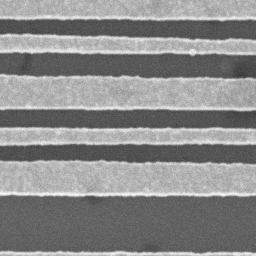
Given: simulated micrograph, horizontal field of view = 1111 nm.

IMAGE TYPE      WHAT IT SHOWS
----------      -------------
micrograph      lines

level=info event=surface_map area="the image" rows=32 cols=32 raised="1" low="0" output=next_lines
11111111111111111111111111111111
11111111111111111111111111111111
00000000000000000000000000000000
00000000000000000000000000000000
11111110000000000000000000000000
11111111111111111111111111111111
10111111111111111111111111111111
00000000000000000000000000000000
00000000000000000000000000000000
11110000000100000000000000000000
11111111111111111111111111111111
11111111111111111111111111111111
11111111111111111111111111111111
11111111101111111111111111111111
00000000000000000000000000000000
00000000000000000000000000000000
11111111111111111111111111111111
11111111111111111111111111111111
00000000000000000000000000000000
00000000000000000000000000000000
11111111111111111111111111111110
11111111111111111111111111111111
11111111111111111111111111111111
11111111111111111111111111111111
00000000000000000000000000000000
00000000000000000000000000000000
00000000000000000000000000000000
00000000000000000000000000000000
00000000000000000000000000000000
00000000000000000000000000000000
00000000000000000000000000000000
00000000000000000000000000000000